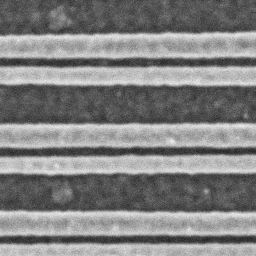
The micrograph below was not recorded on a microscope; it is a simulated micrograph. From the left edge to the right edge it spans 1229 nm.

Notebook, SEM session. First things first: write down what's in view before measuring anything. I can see lines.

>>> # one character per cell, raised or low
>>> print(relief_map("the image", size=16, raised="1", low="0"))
0000000000000000
0000000000000000
1111111111111111
1111111111111111
1111111111111111
0000000000000000
0000000000000000
0000000000000000
1111111111111111
1111111111111111
1111111111111111
0000000000000000
0000000000000000
1111111111111111
1111111111111111
1111111111111111